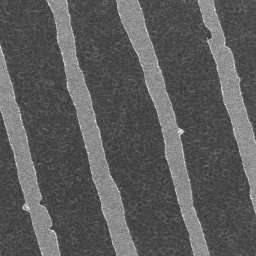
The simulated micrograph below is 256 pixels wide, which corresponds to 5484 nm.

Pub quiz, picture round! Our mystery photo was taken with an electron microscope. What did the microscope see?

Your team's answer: one or a few lines or trenches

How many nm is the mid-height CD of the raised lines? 353